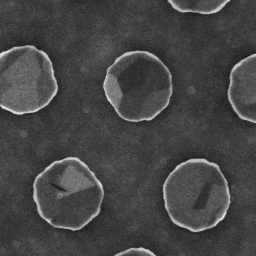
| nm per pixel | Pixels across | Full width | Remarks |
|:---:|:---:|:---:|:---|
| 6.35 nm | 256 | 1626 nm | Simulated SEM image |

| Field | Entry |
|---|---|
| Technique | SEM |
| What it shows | raised bodies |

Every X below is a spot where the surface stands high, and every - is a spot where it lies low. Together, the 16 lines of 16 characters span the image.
-----------XXX--
----------------
----------------
XXX-----XX------
XXX----XXXX----X
XXXX---XXXX---XX
XXX----XXX----XX
--------X-------
----------------
----------------
---XX------XXX--
--XXXX----XXXX--
--XXXX----XXXX--
---XXX-----XXX--
----------------
----------------